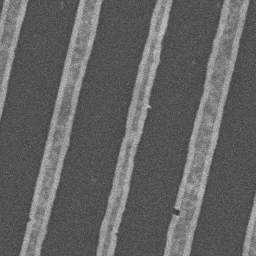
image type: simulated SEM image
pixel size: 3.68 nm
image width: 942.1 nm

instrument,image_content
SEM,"one or a few lines or trenches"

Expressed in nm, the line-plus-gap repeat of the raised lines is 261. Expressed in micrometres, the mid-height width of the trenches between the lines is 0.21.